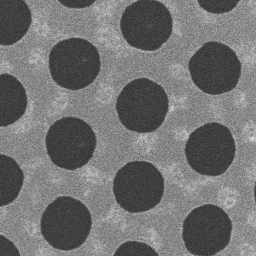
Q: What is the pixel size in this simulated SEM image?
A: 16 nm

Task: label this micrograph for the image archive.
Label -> holes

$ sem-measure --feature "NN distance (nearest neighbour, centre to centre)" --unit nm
1290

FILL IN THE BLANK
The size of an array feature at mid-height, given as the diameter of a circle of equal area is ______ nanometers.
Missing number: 848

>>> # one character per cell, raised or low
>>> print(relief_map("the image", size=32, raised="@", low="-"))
---@@@@@----@@@@----@@@@@-----@@
----@@@@@@@@@@@------@@@@@---@@@
----@@@@@@@@@@@-------@@@@@@@@@@
----@@@@@@@@@@@-------@@@@@@@@@@
---@@@@@@@@@@@@------@@@@@@@@@@@
--@@@@@-----@@@@----@@@@@---@@@@
@@@@@@------@@@@@@@@@@@@-----@@@
@@@@@@-------@@@@@@@@@@@------@@
@@@@@@-------@@@@@@@@@@@------@@
--@@@@------@@@@@@@@@@@@------@@
---@@@@----@@@@@----@@@@------@@
---@@@@@@@@@@@@------@@@@----@@@
---@@@@@@@@@@@@------@@@@@@@@@@@
---@@@@@@@@@@@-------@@@@@@@@@@@
---@@@@@@@@@@@@------@@@@@@@@@@@
-@@@@@@----@@@@-----@@@@@@--@@@@
@@@@@@------@@@@@--@@@@@-----@@@
@@@@@@------@@@@@@@@@@@------@@@
@@@@@@------@@@@@@@@@@@------@@@
-@@@@@------@@@@@@@@@@@------@@@
--@@@@@----@@@@@---@@@@@-----@@@
---@@@@@@@@@@@@-----@@@@@---@@@@
---@@@@@@@@@@@------@@@@@@@@@@@@
---@@@@@@@@@@@-------@@@@@@@@@@@
--@@@@@@@@@@@@------@@@@@@@@@@@@
-@@@@@----@@@@@-----@@@@@@-@@@@@
@@@@@------@@@@@--@@@@@@----@@@@
@@@@@------@@@@@@@@@@@@------@@@
@@@@@------@@@@@@@@@@@@------@@@
-@@@@------@@@@@@@@@@@@------@@@
--@@@@----@@@@@---@@@@@------@@@
--@@@@@@@@@@@@------@@@@---@@@@@